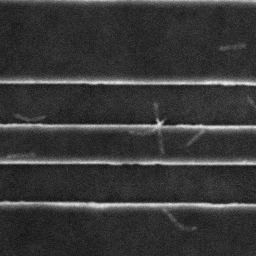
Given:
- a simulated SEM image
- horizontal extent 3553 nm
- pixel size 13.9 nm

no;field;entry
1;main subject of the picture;lines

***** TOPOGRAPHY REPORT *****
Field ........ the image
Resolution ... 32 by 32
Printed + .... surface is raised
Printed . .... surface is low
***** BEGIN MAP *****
++++++++++++++++++++++++++++++++
++++++++++++++++++++++++++++++++
++++++++++++++++++++++++++++++++
++++++++++++++++++++++++++++++++
++++++++++++++++++++++++++++++++
++++++++++++++++++++++++++++++++
++++++++++++++++++++++++++++++++
++++++++++++++++++++++++++++++++
++++++++++++++++++++++++++++++++
++++++++++++++++++++++++++++++++
...............................+
................................
................................
................................
................................
................................
++++++++++++++++++++++++++++++++
++++++++++++++++++++++++++++++++
++++++++++++++++++++++++++++++++
++++++++++++++++++++++++++++++++
.............+++++++++++++++++++
................................
................................
................................
................................
+++++++++++++++++++++++++....+..
++++++++++++++++++++++++++++++++
++++++++++++++++++++++++++++++++
++++++++++++++++++++++++++++++++
++++++++++++++++++++++++++++++++
++++++++++++++++++++++++++++++++
++++++++++++++++++++++++++++++++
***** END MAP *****